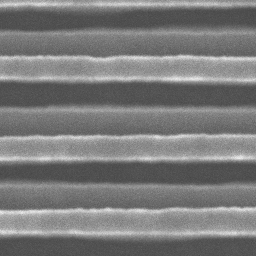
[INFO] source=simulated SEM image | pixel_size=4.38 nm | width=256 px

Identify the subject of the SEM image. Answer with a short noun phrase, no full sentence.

lines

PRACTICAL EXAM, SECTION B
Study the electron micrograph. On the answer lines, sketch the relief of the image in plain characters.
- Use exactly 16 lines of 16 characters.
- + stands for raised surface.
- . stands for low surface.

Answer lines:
................
................
++++++++++++++++
++++++++++++++++
++++++++++++++++
................
................
++++++++++++++++
++++++++++++++++
++++++++++++++++
................
................
++++++++++++++++
++++++++++++++++
++++++++++++++++
................